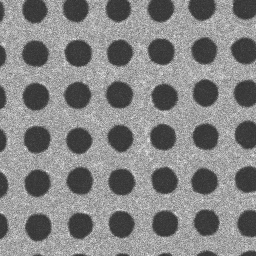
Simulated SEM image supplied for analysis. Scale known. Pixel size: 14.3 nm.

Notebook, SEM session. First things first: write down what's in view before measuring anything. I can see a regular array of holes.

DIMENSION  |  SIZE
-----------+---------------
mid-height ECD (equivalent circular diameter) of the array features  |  388 nm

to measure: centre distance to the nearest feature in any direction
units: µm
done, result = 0.594